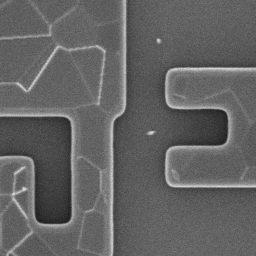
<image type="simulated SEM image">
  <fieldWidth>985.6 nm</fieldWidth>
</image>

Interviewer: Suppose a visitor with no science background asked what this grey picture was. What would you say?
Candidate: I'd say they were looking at wiring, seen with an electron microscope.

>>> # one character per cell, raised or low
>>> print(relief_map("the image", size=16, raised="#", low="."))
########........
########........
########........
########........
########...#####
########..######
########...#####
....###.......##
.....##.......##
....###....#####
##..###...######
##...##....#####
##...##.........
##..###.........
#######.........
#######.........